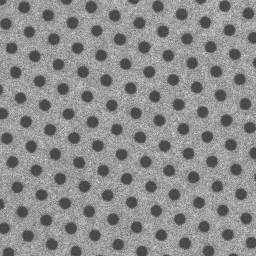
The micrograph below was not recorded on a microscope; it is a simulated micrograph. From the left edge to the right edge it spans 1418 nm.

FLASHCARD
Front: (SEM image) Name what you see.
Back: a regular array of holes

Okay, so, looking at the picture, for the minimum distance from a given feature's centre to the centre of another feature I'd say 136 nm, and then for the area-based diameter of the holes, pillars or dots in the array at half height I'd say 63.5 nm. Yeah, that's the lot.